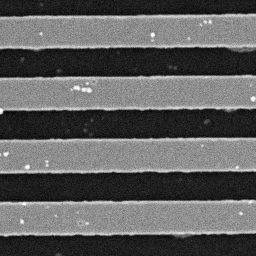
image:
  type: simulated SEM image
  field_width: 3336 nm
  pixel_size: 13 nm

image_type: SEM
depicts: lines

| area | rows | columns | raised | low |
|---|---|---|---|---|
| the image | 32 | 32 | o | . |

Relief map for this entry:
................................
................................
oooooooooooooooooooooooooooooooo
oooooooooooooooooooooooooooooooo
oooooooooooooooooooooooooooooooo
oooooooooooooooooooooooooooooooo
................................
................................
................................
.............................ooo
oooooooooooooooooooooooooooooooo
oooooooooooooooooooooooooooooooo
oooooooooooooooooooooooooooooooo
oooooooooooooooooooooooooooooo.o
................................
................................
................................
.o....oooooooooooooooooooooooooo
oooooooooooooooooooooooooooooooo
oooooooooooooooooooooooooooooooo
oooooooooooooooooooooooooooooooo
ooooooooooooo...................
................................
................................
................................
oooooooooooooooooooooooooooooooo
oooooooooooooooooooooooooooooooo
oooooooooooooooooooooooooooooooo
oooooooooooooooooooooooooooooooo
................................
................................
................................